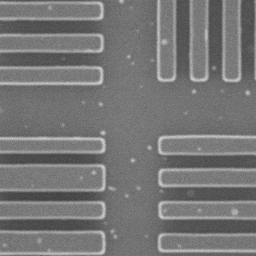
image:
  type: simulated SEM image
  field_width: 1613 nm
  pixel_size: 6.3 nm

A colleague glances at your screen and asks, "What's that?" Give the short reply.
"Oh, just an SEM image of groups of lines, slits or small figures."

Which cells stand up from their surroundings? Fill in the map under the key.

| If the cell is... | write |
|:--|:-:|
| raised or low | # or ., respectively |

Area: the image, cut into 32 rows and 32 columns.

############........##..##..##..
#############.......##..##..##..
....................##..##..##..
....................##..##..##..
############........##..##..##..
#############.......##..##..##..
....................##..##..##..
....................##..##..##..
############........##..##..##..
#############.......##..##..##..
................................
................................
................................
................................
................................
................................
................................
#############.......############
#############.......############
................................
................................
#############.......############
#############.......############
#############...................
................................
#############.......############
#############.......############
................................
................................
#############.......############
#############.......############
#############...................